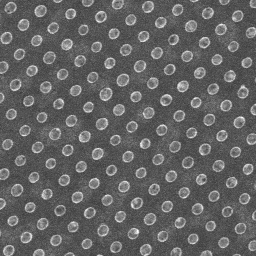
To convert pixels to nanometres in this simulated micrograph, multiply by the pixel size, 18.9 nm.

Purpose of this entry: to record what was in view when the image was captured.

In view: a regular array of raised bodies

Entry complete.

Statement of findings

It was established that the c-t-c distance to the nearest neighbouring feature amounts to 20.8 px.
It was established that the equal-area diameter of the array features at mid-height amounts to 199 nanometers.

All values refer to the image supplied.